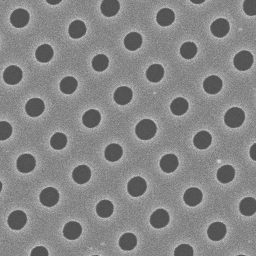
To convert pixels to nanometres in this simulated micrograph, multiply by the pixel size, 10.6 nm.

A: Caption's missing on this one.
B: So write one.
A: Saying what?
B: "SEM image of a regular array of holes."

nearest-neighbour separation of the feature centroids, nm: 414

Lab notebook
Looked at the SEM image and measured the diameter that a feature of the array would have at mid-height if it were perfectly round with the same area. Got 0.206 µm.